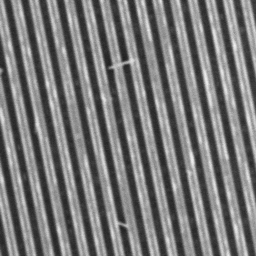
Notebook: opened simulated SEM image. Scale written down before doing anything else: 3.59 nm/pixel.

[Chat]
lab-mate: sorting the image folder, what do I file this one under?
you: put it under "parallel lines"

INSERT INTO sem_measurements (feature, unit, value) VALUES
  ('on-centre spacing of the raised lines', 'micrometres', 0.062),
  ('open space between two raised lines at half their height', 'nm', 32.6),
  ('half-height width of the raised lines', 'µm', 0.0295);